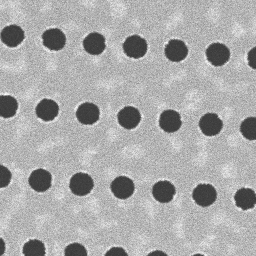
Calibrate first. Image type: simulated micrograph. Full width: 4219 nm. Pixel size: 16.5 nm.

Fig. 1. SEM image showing a regular array of holes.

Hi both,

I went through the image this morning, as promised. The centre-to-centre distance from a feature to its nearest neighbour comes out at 677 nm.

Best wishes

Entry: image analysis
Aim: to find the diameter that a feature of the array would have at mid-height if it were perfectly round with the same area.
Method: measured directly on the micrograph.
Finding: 400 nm